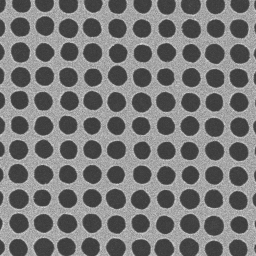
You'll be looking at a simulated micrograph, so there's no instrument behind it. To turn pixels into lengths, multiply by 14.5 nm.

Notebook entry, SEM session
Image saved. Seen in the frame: a regular array of holes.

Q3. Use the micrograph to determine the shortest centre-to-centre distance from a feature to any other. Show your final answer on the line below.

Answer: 345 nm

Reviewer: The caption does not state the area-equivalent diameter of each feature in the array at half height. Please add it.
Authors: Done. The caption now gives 19 px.